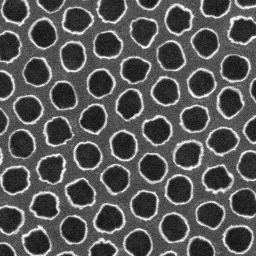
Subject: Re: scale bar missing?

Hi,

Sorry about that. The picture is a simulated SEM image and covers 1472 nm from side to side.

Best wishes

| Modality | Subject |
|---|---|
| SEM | a regular array of raised bodies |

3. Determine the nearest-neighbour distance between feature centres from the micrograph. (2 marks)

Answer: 207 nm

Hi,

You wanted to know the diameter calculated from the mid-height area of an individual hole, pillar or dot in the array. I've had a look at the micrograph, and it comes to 161 nanometers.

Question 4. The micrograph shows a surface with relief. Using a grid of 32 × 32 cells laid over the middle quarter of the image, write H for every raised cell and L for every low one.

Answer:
HHHHHLLLLLLLLLHHHHHHHHLLHHHHHHLL
LHHHLLLLHHLLLLHHHHHHHLLLLHHHLLLL
LLLLLLLHHHHLLLHHHHHHHLLLLLLLLLLL
LLLLLLHHHHHHLLLHHHHHLLLLLHLLLLLH
HLLLLLHHHHHHLLLLHHHLLLLHHHHHLLLH
HHLLLLHHHHHHHLLLLLLLLLLHHHHHHLLH
HHHLLLHHHHHHLLLLHHLLLLHHHHHHHLLH
HHHLLLLHHHHLLLLHHHHLLLHHHHHHHLLL
HHHLLLLLHLLLLLHHHHHLLLLHHHHHHLLL
HHHLLLLLLLLLLHHHHHHHLLLHHHHHLLLL
HHHLLLLHHLLLLHHHHHHHLLLLLLLLLLLL
LLLLLHHHHHLLLHHHHHHLLLLLLLLLLLHH
LLLLHHHHHHLLLLHHHHHLLLLLLLLLLHHH
LLLLHHHHHHHLLLLHHLLLLLLHHLLLLHHH
HLLLHHHHHHHLLLLLLLLLHHHHHHLLLHHH
HHLLHHHHHHLLLLLLLLLLHHHHHHHLLLHH
HHLLLHHHHLLLLLLLLLLLHHHHHHHLLLLH
HHLLLLLLLLLLLHHHHLLLHHHHHHHLLLLL
HHLLLLLLLLLLHHHHHHLLLHHHHHLLLLLL
LLLLLLLLLLLLHHHHHHLLLLHHHLLLLLLH
LLLHHHHHLLLLHHHHHHLLLLLLLLLLLHHH
LLLHHHHHHLLLHHHHHHLLLLLLLLLLHHHH
LLLHHHHHHLLLHHHHHHLLLHHLLLLLHHHH
LLLHHHHHHLLLLLHHHLLLHHHHHLLLHHHH
LLLHHHHHHLLLLLLLLLLHHHHHHLLLHHHH
LLLLHHHHLLLLHHHLLLLHHHHHHHLLLHHH
LLLLLLLLLLHHHHHHLLLHHHHHHHLLLLLL
LLLLLLLLLLHHHHHHLLLHHHHHHLLLLLLL
LLLLHLLLLHHHHHHHLLLLHHHHHLLHHHHL
LLLHHHLLLLHHHHHHLLLLLLLLLLHHHHHH
LHHHHHHLLLHHHHHHLLLLLLLLLLHHHHHH
HHHHHHHHLLLHHHHLLLLLLLLLLHHHHHHH